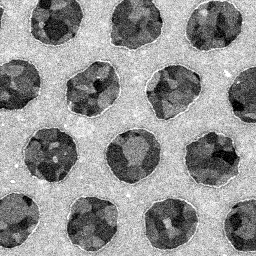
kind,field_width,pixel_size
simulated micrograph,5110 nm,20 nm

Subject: raised bodies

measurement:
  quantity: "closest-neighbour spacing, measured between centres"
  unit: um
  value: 1.53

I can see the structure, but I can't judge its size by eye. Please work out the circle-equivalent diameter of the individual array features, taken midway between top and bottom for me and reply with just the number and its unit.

1.09 µm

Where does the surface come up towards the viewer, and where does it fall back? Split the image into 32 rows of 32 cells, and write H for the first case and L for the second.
LLLLLHHHHHLLLLLHHHHLLLLLLHHHHLLL
LLLLHHHHHHLLLLHHHHHHLLLLHHHHHHLL
LLLLHHHHHHLLLLHHHHHHLLLHHHHHHHLL
LLLLHHHHHHLLLLHHHHHHLLLHHHHHHHLL
LLLLHHHHHLLLLLHHHHHHLLLHHHHHHHLL
LLLLLHHHLLLLLLHHHHLLLLLLHHHHHLLL
LLLLLLLLLLLLLLLLLLLLLLLLLLLLLLLL
LHHLLLLLLLLLLLLLLLLLLLLLLLLLLLLL
HHHHHLLLLLLHHHLLLLLLHHHLLLLLLLLH
HHHHHLLLLHHHHHHLLLLHHHHHHLLLLLHH
HHHHHLLLHHHHHHHLLLHHHHHHHLLLLHHH
HHHHHLLLHHHHHHHLLLHHHHHHHLLLHHHH
HHHHLLLLHHHHHHLLLLHHHHHHLLLLLHHH
HHHLLLLLLHHHHHLLLLLHHHHLLLLLLHHH
LLLLLLLLLLLHLLLLLLLHHHLLLLLLLHHH
LLLLLLLLLLLLLLLLLLLLLLLLLLLLLLLL
LLLLLHHHLLLLLLLHHHHLLLLLLLHLLLLL
LLLLHHHHHLLLLLHHHHHHLLLLHHHHHLLL
LLLHHHHHHHLLLHHHHHHHLLLHHHHHHLLL
LLLHHHHHHHLLLHHHHHHHLLLHHHHHHHLL
LLLHHHHHHLLLLHHHHHHHLLLHHHHHHHLL
LLLLHHHHHLLLLLHHHHHLLLLLHHHHHHLL
LLLLLHHHLLLLLLLHHHLLLLLLHHHHHLLL
LLLLLLLLLLLLLLLLLLLLLLLLLLLLLLLL
LHHHLLLLLLLLLLLLLLLLLLLLLLLLLLLL
HHHHHLLLLHHHHHLLLLLHHHHHLLLLLHHH
HHHHHLLLLHHHHHHLLLHHHHHHHLLLLHHH
HHHHHLLLHHHHHHHLLLHHHHHHHLLLHHHH
HHHHLLLLHHHHHHHLLLHHHHHHHLLLHHHH
HHHHLLLLLHHHHHLLLLHHHHHHLLLLHHHH
HHHLLLLLLHHHHLLLLLLHHHHLLLLLLHHH
LLLLLLLLLLLLLLLLLLLLLLLLLLLLLLLL